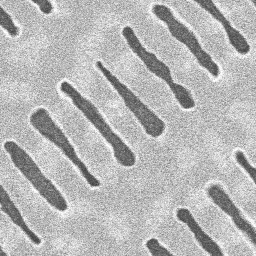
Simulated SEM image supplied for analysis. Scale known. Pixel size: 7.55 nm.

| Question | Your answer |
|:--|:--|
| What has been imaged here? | holes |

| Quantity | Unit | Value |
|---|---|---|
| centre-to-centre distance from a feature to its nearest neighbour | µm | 0.31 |